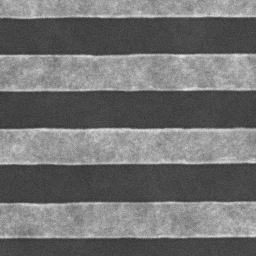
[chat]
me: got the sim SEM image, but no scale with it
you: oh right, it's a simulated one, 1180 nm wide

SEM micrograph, wiring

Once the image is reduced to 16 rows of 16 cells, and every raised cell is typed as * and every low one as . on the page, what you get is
****************
................
................
*****...********
****************
****************
................
................
****************
****************
................
................
................
****************
****************
................